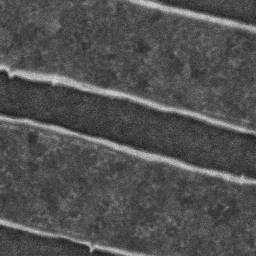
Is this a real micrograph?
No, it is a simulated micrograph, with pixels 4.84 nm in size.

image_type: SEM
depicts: one or a few lines or trenches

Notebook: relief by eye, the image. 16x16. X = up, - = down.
XXXXXXXXXX------
XXXXXXXXXXXXXXX-
XXXXXXXXXXXXXXXX
XXXXXXXXXXXXXXXX
-XXXXXXXXXXXXXXX
------XXXXXXXXXX
---------XXXXXXX
X------------XXX
XXXXX-----------
XXXXXXXX--------
XXXXXXXXXXXX----
XXXXXXXXXXXXXXXX
XXXXXXXXXXXXXXXX
XXXXXXXXXXXXXXXX
--XXXXXXXXXXXXXX
-------XXXXXXXXX